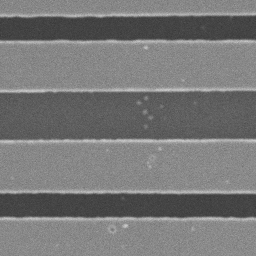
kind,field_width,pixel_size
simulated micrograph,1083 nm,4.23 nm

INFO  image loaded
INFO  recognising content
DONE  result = lines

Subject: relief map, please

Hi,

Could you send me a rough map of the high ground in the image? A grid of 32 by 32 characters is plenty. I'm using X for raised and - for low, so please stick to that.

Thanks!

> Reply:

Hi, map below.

XXXXXXXXXXXXXXXXXXXXXXXXXXXXXXXX
XXXXXXXXXXXXXXXXXXXXXXXXXXXXXXXX
--------------------------------
--------------------------------
--------------------------------
XXXXXXXXXXXXXXXXXXXXXXXXXXXXXXXX
XXXXXXXXXXXXXXXXXXXXXXXXXXXXXXXX
XXXXXXXXXXXXXXXXXXXXXXXXXXXXXXXX
XXXXXXXXXXXXXXXXXXXXXXXXXXXXXXXX
XXXXXXXXXXXXXXXXXXXXXXXXXXXXXXXX
XXXXXXXXXXXXXXXXXXXXXXXXXXXXXXXX
--------------------------------
--------------------------------
--------------------------------
--------------------------------
--------------------------------
--------------------------------
--------XXXXXXXXXXXXXXXXXXXXXXXX
XXXXXXXXXXXXXXXXXXXXXXXXXXXXXXXX
XXXXXXXXXXXXXXXXXXXXXXXXXXXXXXXX
XXXXXXXXXXXXXXXXXXXXXXXXXXXXXXXX
XXXXXXXXXXXXXXXXXXXXXXXXXXXXXXXX
XXXXXXXXXXXXXXXXXXXXXXXXXXXXXXXX
XXXXXXXXXXXXXXXXXXXXXXXXXXXXXXXX
--------------------------------
--------------------------------
--------------------------------
XXXXXXXXXXXXXXXXXXXXXXXXXXXXXXXX
XXXXXXXXXXXXXXXXXXXXXXXXXXXXXXXX
XXXXXXXXXXXXXXXXXXXXXXXXXXXXXXXX
XXXXXXXXXXXXXXXXXXXXXXXXXXXXXXXX
XXXXXXXXXXXXXXXXXXXXXXXXXXXXXXXX